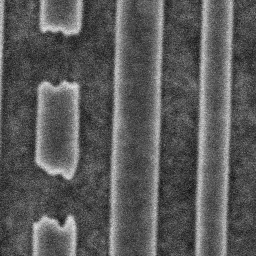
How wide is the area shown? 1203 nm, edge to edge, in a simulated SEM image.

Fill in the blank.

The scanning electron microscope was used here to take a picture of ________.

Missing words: one or a few lines or trenches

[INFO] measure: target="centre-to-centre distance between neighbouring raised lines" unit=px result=78.1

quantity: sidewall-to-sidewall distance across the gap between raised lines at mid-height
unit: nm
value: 194